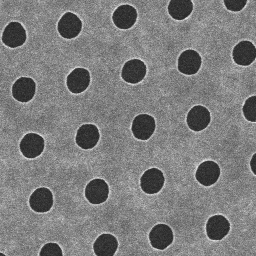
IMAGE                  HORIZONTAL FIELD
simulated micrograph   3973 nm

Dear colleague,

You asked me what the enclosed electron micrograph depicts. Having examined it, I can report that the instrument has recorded a regular array of holes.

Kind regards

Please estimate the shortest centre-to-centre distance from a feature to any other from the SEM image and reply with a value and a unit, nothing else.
858 nanometres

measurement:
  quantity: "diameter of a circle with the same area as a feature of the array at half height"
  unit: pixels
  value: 24.9